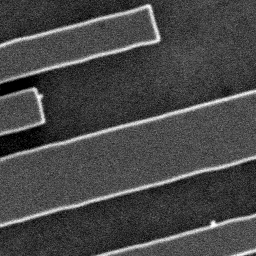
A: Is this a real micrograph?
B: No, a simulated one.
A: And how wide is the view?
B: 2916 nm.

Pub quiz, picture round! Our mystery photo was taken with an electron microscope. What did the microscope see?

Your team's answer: groups of lines, slits or small figures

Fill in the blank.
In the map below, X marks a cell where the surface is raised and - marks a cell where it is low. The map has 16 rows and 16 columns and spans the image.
----------------
-----XXXXX------
-XXXXXXXXX------
XXXXXX----------
XX--------------
----------------
XXX----------XXX
XXX------XXXXXXX
-----XXXXXXXXXXX
-XXXXXXXXXXXXXXX
XXXXXXXXXXXXXX--
XXXXXXXXXX------
XXXXXX----------
XX--------------
------------XXXX
--------XXXXXXXX